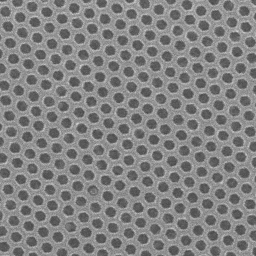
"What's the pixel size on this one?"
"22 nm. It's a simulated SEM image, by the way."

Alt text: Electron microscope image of a regular array of holes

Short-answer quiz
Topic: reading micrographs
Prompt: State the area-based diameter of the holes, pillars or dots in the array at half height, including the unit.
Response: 247 nm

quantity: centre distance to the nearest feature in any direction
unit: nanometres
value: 336